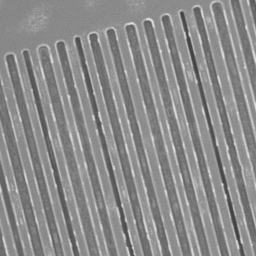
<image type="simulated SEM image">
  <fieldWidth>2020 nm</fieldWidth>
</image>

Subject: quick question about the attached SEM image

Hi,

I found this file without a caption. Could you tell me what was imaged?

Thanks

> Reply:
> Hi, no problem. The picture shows parallel lines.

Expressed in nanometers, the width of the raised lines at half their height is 78.4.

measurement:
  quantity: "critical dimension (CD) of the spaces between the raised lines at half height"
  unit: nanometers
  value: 65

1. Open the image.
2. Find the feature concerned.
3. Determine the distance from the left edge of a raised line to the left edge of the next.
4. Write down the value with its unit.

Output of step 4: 0.141 um